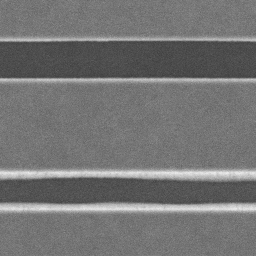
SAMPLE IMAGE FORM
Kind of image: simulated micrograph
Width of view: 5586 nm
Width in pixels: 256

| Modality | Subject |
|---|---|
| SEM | lines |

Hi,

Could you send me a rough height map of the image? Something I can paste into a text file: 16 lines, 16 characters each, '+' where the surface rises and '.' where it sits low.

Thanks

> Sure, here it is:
++++++++++++++++
++++++++++++++++
++++++++++++++++
................
................
++++++++++++++++
++++++++++++++++
++++++++++++++++
++++++++++++++++
++++++++++++++++
++++++++++++++++
................
................
++++++++++++++++
++++++++++++++++
++++++++++++++++